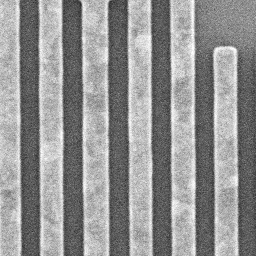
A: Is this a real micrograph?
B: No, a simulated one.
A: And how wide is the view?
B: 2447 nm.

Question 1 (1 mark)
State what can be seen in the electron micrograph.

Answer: wiring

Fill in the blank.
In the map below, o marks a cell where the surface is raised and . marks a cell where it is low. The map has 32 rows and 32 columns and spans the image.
oo...ooo..oooo..ooo..ooo........
oo...ooo..ooo...ooo..ooo........
oo...ooo..ooo...ooo..ooo........
oo...ooo..ooo...ooo..ooo........
oo...ooo..ooo...ooo..ooo........
oo...ooo..ooo...ooo..ooo........
oo...ooo..ooo...ooo..ooo...oo...
oo...ooo..ooo...ooo..ooo...ooo..
oo...ooo..ooo...ooo..ooo...ooo..
oo...ooo..ooo...ooo..ooo...ooo..
oo...ooo..ooo...ooo..ooo...ooo..
oo...ooo..ooo...ooo..ooo...ooo..
oo...ooo..ooo...ooo..ooo...ooo..
oo...ooo..ooo...ooo..ooo...ooo..
oo...ooo..ooo...ooo..ooo...ooo..
oo...ooo..ooo...ooo..ooo...ooo..
oo...ooo..ooo...ooo..ooo...ooo..
oo...ooo..ooo...ooo...oo...ooo..
oo...ooo..ooo...ooo..ooo...ooo..
oo...ooo..ooo...ooo..ooo...ooo..
oo...ooo..ooo...ooo..ooo...ooo..
oo...ooo..ooo...ooo..ooo...ooo..
oo...ooo..ooo...ooo...oo...ooo..
oo...ooo..ooo...ooo...oo...ooo..
oo...ooo..ooo...ooo...oo...ooo..
oo...ooo...oo...ooo...oo...ooo..
oo...ooo...oo...ooo...oo...ooo..
oo...ooo...oo...ooo...oo...ooo..
oo...ooo...oo...ooo...oo...ooo..
ooo..ooo...oo...ooo...oo...ooo..
ooo..ooo...oo...ooo...oo...ooo..
ooo..ooo...oo...ooo...oo...ooo..